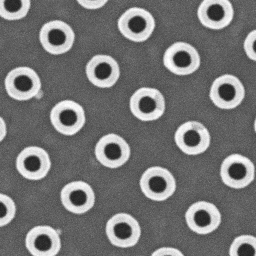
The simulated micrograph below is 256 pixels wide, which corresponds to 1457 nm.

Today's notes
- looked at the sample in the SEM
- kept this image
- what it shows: a regular array of ring-shaped raised bodies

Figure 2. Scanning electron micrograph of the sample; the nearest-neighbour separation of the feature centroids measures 318 nm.